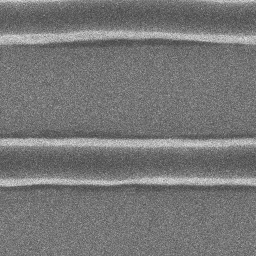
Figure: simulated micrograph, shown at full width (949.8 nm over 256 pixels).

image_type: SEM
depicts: one or a few lines or trenches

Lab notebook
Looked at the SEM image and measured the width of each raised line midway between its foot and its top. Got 150 nanometers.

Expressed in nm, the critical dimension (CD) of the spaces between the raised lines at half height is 385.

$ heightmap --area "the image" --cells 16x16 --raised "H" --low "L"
HHHHHHHHHHHHHHHH
HHHHHHHHHHHHHHHH
LHHLLLLLLLLLLLLL
LLLLLLLLLLLLLLLL
LLLLLLLLLLLLLLLL
LLLLLLLLLLLLLLLL
LLLLLLLLLLLLLLLL
LLLLLLLLLLLLLLLL
LLLLLLLLLLLLLLLL
HHHHHHHHHHHHHHHH
HHHHHHHHHHHHHHHH
HLLLLLLLLLLLLLLL
LLLLLLLLLLLLLLLL
LLLLLLLLLLLLLLLL
LLLLLLLLLLLLLLLL
LLLLLLLLLLLLLLLL